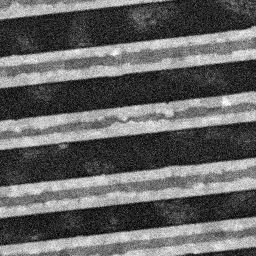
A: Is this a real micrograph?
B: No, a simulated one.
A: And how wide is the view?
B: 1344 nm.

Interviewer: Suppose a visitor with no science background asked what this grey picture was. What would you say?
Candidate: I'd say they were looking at one or a few lines or trenches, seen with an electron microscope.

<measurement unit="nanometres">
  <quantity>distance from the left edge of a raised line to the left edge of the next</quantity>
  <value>334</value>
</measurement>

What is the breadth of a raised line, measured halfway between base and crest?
129 nm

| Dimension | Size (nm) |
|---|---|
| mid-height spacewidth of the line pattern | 204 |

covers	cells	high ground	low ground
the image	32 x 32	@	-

@@@@@@@@@@@@@-------------------
@@@@----------------------------
--------------------------------
--------------------------------
----------------------------@@@@
-------------------@@@@@@@@@@@@@
---------@-@@@@@@@@@@@@@@@@@@@@@
-@@@@@@@@@@@@@@@@@@@@@@@@@@-----
@@@@@@@@@@@@@@@@@@--------------
@@@@@@@@@-----------------------
--------------------------------
--------------------------------
---------------------------@@@@@
------------------@@@@@@@@@@@@@@
----------@@@@@@@@@@@@@@@@@@@@@@
-@@@@@@@@@@@@@@@@@@@@@@@--------
@@@@@@@@@@@@@@@-----------------
@@@@@@--------------------------
--------------------------------
--------------------------------
------------------------------@@
--------------------@@@@@@@@@@@@
------------@@@@@@@@@@@@@@@@@@@@
----@@@@@@@@@@@@@@@@@@@@@@@@@---
@@@@@@@@@@@@@@@@@@@@------------
@@@@@@@@@@@---------------------
@@------------------------------
--------------------------------
------------------------@@@@@@@@
---------------@@@@@@@@@@@@@@@@@
------@@@@@@@@@@@@@@@@@@@@@@@@@-
@@@@@@@@@@@@@@@@@@@@@@----------